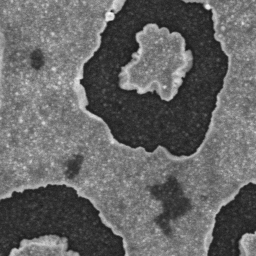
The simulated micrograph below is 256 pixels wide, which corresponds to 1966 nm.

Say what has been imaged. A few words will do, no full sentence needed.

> ring-shaped grooves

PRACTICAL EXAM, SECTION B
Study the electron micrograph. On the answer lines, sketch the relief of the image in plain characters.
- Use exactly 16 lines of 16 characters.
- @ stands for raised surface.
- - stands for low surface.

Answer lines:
@@@@@@@------@@@
@@@@@@@------@@@
@@@@@@---@@---@@
@@@@@@--@@@@--@@
@@@@@---@@@---@@
@@@@@---@-@---@@
@@@@@--------@@@
@@@@@@-------@@@
@@@@@@@------@@@
@@@@@@@@@@--@@@@
@@@@@@@@@@@@@@@@
@@@@@@@@@@@@@@@@
-----@@@@@@@@@--
------@@@@@@@@--
-------@@@@@@---
-@@@----@@@@@--@